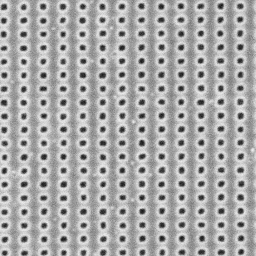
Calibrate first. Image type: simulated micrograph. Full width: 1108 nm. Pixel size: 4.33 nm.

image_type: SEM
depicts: a regular array of holes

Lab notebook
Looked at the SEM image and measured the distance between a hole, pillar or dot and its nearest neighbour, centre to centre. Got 58.2 nanometers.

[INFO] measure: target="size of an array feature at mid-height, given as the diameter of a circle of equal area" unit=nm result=30.5